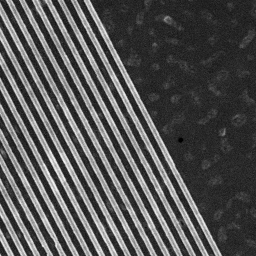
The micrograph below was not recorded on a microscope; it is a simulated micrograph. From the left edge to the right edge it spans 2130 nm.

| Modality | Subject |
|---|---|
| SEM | parallel lines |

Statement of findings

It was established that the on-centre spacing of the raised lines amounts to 95.9 nanometers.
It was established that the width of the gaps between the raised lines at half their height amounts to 61.9 nm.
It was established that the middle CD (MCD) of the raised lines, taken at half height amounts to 33.2 nanometers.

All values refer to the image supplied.